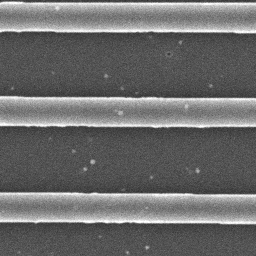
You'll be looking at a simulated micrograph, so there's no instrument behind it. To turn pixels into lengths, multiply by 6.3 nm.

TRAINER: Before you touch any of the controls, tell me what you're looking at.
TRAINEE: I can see lines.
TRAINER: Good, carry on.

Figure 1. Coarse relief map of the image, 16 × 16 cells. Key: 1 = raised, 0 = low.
1111111111111111
1111111111111111
0000000000000000
0000000000000000
0000000000000000
0000000000000000
1111111111111111
1111111111111111
0000000000000000
0000000000000000
0000000000000000
0000000000000000
1111111111111111
1111111111111111
0000000000000000
0000000000000000